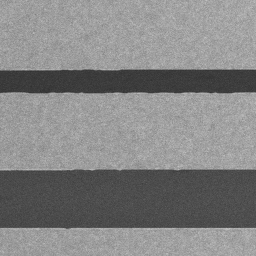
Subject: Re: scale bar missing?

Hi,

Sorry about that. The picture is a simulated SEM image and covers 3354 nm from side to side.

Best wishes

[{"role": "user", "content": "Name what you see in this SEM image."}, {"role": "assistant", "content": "lines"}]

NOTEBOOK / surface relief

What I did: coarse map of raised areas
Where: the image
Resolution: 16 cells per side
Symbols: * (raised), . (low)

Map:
****************
****************
****************
****************
................
................
****************
****************
****************
****************
****************
................
................
................
****************
****************